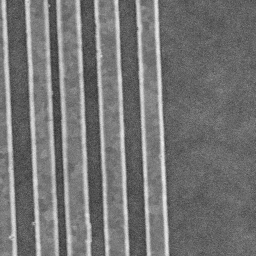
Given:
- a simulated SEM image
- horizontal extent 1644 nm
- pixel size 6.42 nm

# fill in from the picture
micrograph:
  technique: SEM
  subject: parallel lines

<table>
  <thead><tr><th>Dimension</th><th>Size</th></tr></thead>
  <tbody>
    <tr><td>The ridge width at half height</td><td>122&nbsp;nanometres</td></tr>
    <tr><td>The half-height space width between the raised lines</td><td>131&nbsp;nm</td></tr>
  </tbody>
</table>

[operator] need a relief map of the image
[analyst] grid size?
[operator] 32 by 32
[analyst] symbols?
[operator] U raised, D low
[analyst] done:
DDDUUUDUUUDDUUUDDUUUDDDDDDDDDDDD
DDDDUUDUUUDDUUUDDUUUDDDDDDDDDDDD
UDDDUUDUUUDDUUUDDUUDDDDDDDDDDDDD
UDDDUUDDUUDDUUUDDDUUDDDDDDDDDDDD
UDDDUUDDUUDDUUUDDDUUDDDDDDDDDDDD
UDDDUUDDUUDDUUUDDDUUDDDDDDDDDDDD
UDDDUUDDUUDDUUUDDDUUDDDDDDDDDDDD
UDDDUUDDUUDDUUUDDDUUDDDDDDDDDDDD
UDDDUUDDUUDDUUUDDDUUDDDDDDDDDDDD
UDDDUUDDUUDDDUUDDDUUDDDDDDDDDDDD
UDDDUUDDUUDDDUUDDDUUDDDDDDDDDDDD
UDDDUUDDUUDDDUUDDDUUDDDDDDDDDDDD
UDDDUUDDUUDDDUUDDDUUDDDDDDDDDDDD
UDDDUUDDUUDDDUUDDDUUDDDDDDDDDDDD
UDDDUUDDUUDDDUUDDDUUDDDDDDDDDDDD
UDDDUUDDUUDDDUUDDDUUDDDDDDDDDDDD
UDDDUUDDUUDDDUUDDDUUDDDDDDDDDDDD
UDDDUUDDUUDDDUUDDDUUDDDDDDDDDDDD
UDDDUUDDUUDDDUUDDDUUDDDDDDDDDDDD
UDDDUUDDUUUDDUUDDDUUDDDDDDDDDDDD
UDDDUUUDUUUDDUUDDDUUDDDDDDDDDDDD
UDDDUUUDUUUDDUUDDDUUDDDDDDDDDDDD
UDDDUUUDUUUDDUUDDDUUDDDDDDDDDDDD
UDDDUUUDUUUDDUUDDDUUDDDDDDDDDDDD
UDDDDUUDUUUDDUUUDDUUDDDDDDDDDDDD
UUDDDUUDUUUDDUUUDDUUUDDDDDDDDDDD
UUDDDUUDDUUDDUUUDDUUUDDDDDDDDDDD
UUDDDUUDDUUDDUUUDDDUUDDDDDDDDDDD
UUDDDUUDDUUDDUUUDDDUUDDDDDDDDDDD
UUDDDUUDDUUDDUUUDDDUUDDDDDDDDDDD
UUDDDUUDDUUDDUUUDDDUUDDDDDDDDDDD
UUDDDUUDDUUDDUUUDDDUUDDDDDDDDDDD